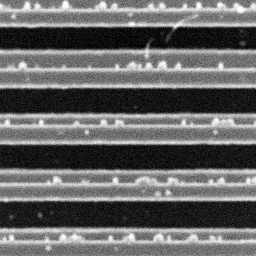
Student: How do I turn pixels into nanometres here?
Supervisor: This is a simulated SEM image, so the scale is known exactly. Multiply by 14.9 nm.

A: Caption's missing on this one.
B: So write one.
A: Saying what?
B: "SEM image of lines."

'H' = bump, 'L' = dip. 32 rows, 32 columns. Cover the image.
HHHHHHHHHHHHHHHHHHHHHHHHHHHHHHHH
HHHHHHHHHHHHHHHHHHHHHHHHHHHHHHHH
HHHHHHHHHHHHHHHHHHHHHHHHHHHHHHHH
LLLLLLLLLLLLLLLLLLLLLLLLLLLLLLLL
LLLLLLLLLLLLLLLLLLLLLLLLLLLLLLLL
LLLLLLLLLLLLLLLLLLLLLLLLLLLLLLLL
HHHLLHHHHHHHHHHHHHHHHHHHHHHHHHHH
HHHHHHHHHHHHHHHHHHHHHHHHHHHHHHHH
HHHHHHHHHHHHHHHHHHHHHHHHHHHHHHHH
HHHHHHHHHHHHHHHHHHHHHHHHHHHHHHHH
HHHHHHHHHHHHHHHHHHHHHHHHHHHHHHHH
LLLLLLLLLLLLLLLLLLLLLLLLLLLLLLLL
LLLLLLLLLLLLLLLLLLLLLLLLLLLLLLLL
LLLLLLLLLLLLLLLLLLLLLLLLLLLLLLLL
HHLHHHHLHHHHHHHHHHHHHHHHHHHHHHHH
HHHHHHHHHHHHHHHHHHHHHHHHHHHHHHHH
HHHHHHHHHHHHHHHHHHHHHHHHHHHHHHHH
HHHHHHHHHHHHHHHHHHHHHHHHHHHHHHHH
LLLLLLLLLLLLLLLLLLLLLLLLLLLLLLLL
LLLLLLLLLLLLLLLLLLLLLLLLLLLLLLLL
LLLLLLLLLLLLLLLLLLLLLLLLLLLLLLLL
HHHHHHHHHHHHHHHHHHHHHHHHHHHHHHHH
HHHHHHHHHHHHHHHHHHHHHHHHHHHHHHHH
HHHHHHHHHHHHHHHHHHHHHHHHHHHHHHHH
HHHHHHHHHHHHHHHHHHHHHHHHHHHHHHHH
LLLLLLLLLLLLLLLLLLLLLLLLLLLLLLLL
LLLLLLLLLLLLLLLLLLLLLLLLLLLLLLLL
LLLLLLLLLLLLLLLLLLLLLLLLLLLLLLLL
LLLLLLLLLLLLLLLLLLLLLLLLLLLLLLLL
HHHHHHHHHHHHHHHHHHHHHHHHHHHHHHHH
HHHHHHHHHHHHHHHHHHHHHHHHHHHHHHHH
HHHHHHHHHHHHHHHHHHHHHHHHHHHHHHHH